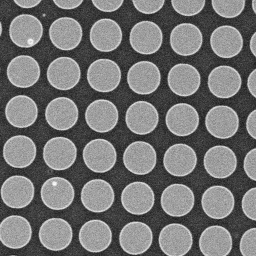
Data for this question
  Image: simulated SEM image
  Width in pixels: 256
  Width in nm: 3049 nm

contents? an array of small figures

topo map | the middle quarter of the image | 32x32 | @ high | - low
@@@----@@@@@@----@@@@@@-----@@@@
@@@@--@@@@@@@@--@@@@@@@@---@@@@@
@@@@--@@@@@@@@--@@@@@@@@--@@@@@@
@@@@--@@@@@@@@--@@@@@@@@--@@@@@@
@@@---@@@@@@@@--@@@@@@@@--@@@@@@
@@-----@@@@@@---@@@@@@@@--@@@@@@
--------@@@@-----@@@@@@----@@@@@
----------------------------@@@@
--------------------------------
@@------@@@--------@------------
@@@---@@@@@@@----@@@@@-----@@@@@
@@@---@@@@@@@---@@@@@@@---@@@@@@
@@@--@@@@@@@@---@@@@@@@---@@@@@@
@@@--@@@@@@@@---@@@@@@@---@@@@@@
@@@---@@@@@@@---@@@@@@@---@@@@@@
@@----@@@@@@@---@@@@@@@---@@@@@@
--------@@@------@@@@@----@@@@@@
-------------------@--------@@@-
--------------------------------
@@----@@@@@--------@------------
@@@---@@@@@@----@@@@@@-----@@@@-
@@@--@@@@@@@@--@@@@@@@@---@@@@@@
@@@--@@@@@@@@--@@@@@@@@--@@@@@@@
@@@--@@@@@@@@--@@@@@@@@--@@@@@@@
@@---@@@@@@@@--@@@@@@@@--@@@@@@@
@-----@@@@@@---@@@@@@@@--@@@@@@@
-------@@@@-----@@@@@@----@@@@@@
-------------------@-------@@@@-
--------------------------------
@-----@@@@----------------------
@@---@@@@@@-----@@@@@------@@@--
@@---@@@@@@@---@@@@@@@---@@@@@@@